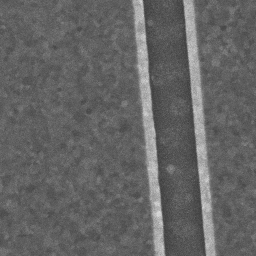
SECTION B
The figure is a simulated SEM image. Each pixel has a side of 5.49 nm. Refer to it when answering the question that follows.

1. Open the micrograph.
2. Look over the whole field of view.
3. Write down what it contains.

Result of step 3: one or a few lines or trenches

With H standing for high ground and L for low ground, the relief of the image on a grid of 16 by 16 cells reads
HHHHHHHHHLLLHHHH
HHHHHHHHHLLLHHHH
HHHHHHHHHLLLHHHH
HHHHHHHHHLLLHHHH
HHHHHHHHHLLLHHHH
HHHHHHHHHLLLHHHH
HHHHHHHHHLLLHHHH
HHHHHHHHHLLLHHHH
HHHHHHHHHLLLLHHH
HHHHHHHHHLLLLHHH
HHHHHHHHHHLLLHHH
HHHHHHHHHHLLLHHH
HHHHHHHHHHLLLHHH
HHHHHHHHHHLLLHHH
HHHHHHHHHHLLLHHH
HHHHHHHHHHLLLHHH